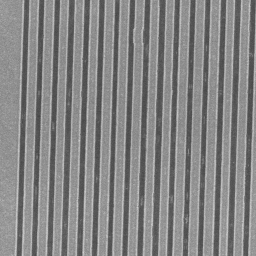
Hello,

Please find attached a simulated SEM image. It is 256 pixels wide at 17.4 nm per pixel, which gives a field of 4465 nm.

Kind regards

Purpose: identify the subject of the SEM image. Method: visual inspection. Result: parallel lines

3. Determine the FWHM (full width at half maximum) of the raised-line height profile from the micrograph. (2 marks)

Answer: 139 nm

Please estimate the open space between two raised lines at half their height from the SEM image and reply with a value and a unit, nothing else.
0.12 µm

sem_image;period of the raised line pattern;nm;263